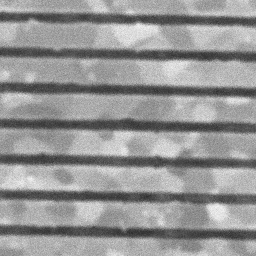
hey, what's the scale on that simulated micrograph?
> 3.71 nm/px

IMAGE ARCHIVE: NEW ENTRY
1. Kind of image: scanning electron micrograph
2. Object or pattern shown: parallel lines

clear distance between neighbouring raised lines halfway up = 0.0427 µm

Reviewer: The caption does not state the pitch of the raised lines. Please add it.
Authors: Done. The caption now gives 132 nm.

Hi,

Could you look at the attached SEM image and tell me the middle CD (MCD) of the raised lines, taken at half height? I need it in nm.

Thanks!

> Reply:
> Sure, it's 88.6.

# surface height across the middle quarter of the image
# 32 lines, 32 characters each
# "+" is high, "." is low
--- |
++++++++++++++++++++++++++++++++
++++++++++++++++++++++++++++++++
++++++++++++++++++++++++++++++++
++++++++++++++++++++++++++++++++
++++++++++++++++++++++++++++++++
................................
................................
................................
+++++++++++++++++++++++++++++++.
++++++++++++++++++++++++++++++++
++++++++++++++++++++++++++++++++
++++++++++++++++++++++++++++++++
++++++++++++++++++++++++++++++++
++++++++++++++...+++++++++++++++
................................
................................
................................
++++++++++++++++++++++++++++++++
++++++++++++++++++++++++++++++++
++++++++++++++++++++++++++++++++
++++++++++++++++++++++++++++++++
++++++++++++++++++++++++++++++++
.+++++++++++++++++++++++++++++++
................................
................................
................................
++++++++++++++++++++++++++++++++
++++++++++++++++++++++++++++++++
++++++++++++++++++++++++++++++++
++++++++++++++++++++++++++++++++
++++++++++++++++++++++++++++++++
........++++++++++++++++++++++++